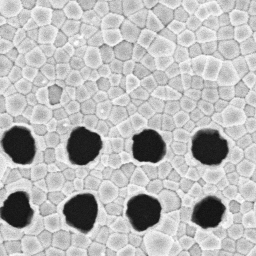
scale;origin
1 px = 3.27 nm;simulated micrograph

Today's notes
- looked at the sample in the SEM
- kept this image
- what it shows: holes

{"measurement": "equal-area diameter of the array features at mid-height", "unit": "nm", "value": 112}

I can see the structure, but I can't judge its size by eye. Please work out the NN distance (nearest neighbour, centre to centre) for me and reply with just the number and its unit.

203 nanometers